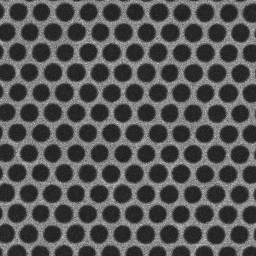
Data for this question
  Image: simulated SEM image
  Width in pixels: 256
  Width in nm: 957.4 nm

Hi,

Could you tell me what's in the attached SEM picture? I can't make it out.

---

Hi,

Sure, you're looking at a regular array of holes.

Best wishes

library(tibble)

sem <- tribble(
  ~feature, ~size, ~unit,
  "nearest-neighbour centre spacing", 86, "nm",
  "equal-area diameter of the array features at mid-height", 0.0676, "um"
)